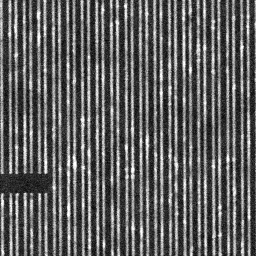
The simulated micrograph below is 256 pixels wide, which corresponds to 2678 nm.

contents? parallel lines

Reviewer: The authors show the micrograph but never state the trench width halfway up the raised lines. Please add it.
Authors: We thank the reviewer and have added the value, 57.6 nm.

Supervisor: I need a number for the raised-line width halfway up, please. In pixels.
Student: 2.12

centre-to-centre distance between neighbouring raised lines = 7.25 px